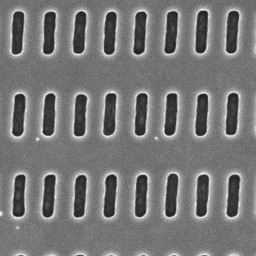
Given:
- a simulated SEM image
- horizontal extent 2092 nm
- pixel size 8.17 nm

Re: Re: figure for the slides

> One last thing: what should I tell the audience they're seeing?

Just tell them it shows a regular array of holes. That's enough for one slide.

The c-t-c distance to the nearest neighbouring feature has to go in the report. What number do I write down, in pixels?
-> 30.3